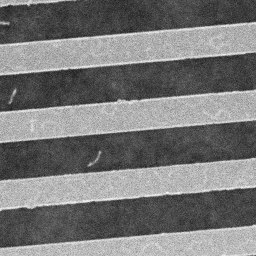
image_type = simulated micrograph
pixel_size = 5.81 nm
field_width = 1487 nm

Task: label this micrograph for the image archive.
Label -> one or a few lines or trenches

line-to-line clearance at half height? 227 nanometres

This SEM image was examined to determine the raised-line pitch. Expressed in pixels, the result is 67.4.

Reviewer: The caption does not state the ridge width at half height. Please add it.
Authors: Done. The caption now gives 0.169 microns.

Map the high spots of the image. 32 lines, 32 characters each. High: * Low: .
****............................
................................
................................
.........................*******
..............******************
..******************************
********************************
*********************...........
*********.......................
................................
................................
..............................**
..................**************
.......*************************
********************************
**************************......
***************.................
****............................
................................
................................
........................********
.............*******************
..******************************
******************************..
******************..............
*******.........................
................................
................................
.............................***
..................**************
......**************************
********************************